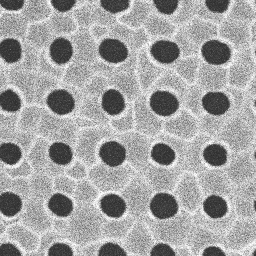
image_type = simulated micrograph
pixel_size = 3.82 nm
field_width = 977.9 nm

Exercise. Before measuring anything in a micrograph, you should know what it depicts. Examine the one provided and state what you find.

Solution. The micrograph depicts a regular array of holes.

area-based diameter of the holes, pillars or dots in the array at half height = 0.0975 microns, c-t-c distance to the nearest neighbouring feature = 195 nanometers